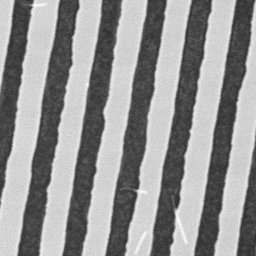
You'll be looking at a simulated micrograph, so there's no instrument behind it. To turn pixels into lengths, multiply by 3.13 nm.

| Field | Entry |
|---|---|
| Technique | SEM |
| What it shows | lines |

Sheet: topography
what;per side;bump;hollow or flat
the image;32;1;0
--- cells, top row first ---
11001110001110011100011100111000
11001110001110011100011100111000
10001110001110011100111000111001
10001110011100011100111000111001
10011110011100011100111000111001
10011110011100111100111000111001
10011100011100111000111000110001
10011100011100111000111001110001
00011100011000111000110001110001
00011100011000111001110001110001
00011100111000111001110001110011
00111000111000110001110001110011
00111000111001110001110011110011
00111000111001110001110011100011
00111000110001110011110011100011
00111001110001110011110011100111
00111001110001110011100011100111
00111001110001100011100011100111
01110001110011100011100111000111
01110001110011100011100111000111
01110001110011100011000111000110
01110011100011100111000111001110
01110011100011100111000111001110
11110011100011000111000111001110
11100011100111000111001111001110
11100011100111000111001110001100
11100011100111000111001110001100
11100011000111001110001110011100
11100111000111001110001110011100
11100111000111001110001110011100
11000111001110001110001100011100
11000111001110001110011100011100